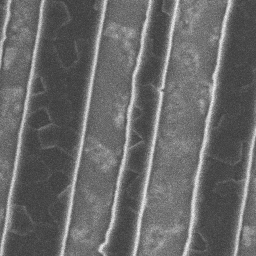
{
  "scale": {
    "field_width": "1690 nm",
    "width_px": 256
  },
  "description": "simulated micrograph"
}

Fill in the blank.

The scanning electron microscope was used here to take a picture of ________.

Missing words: one or a few lines or trenches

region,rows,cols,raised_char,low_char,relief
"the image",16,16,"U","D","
UDDUUUUDDUUDDDUU
DDUUUUDDDUUDDDUU
DDUUUUDDDUUDDDUU
DDUUUUDDDUUDDDUU
DDUUUUDDUUDDDUUU
DDUUUUDDUUDDDUUU
DDUUUUDDUUDDDUUU
DUUUUDDDUUDDDUUU
DUUUUDDDUUDDDUUU
DUUUUDDDUUDDDUUU
DUUUUDDDUDDDUUUU
DUUUUDDUUDDDUUUD
DUUUDDDUUDDDUUUD
UUUUDDDUUDDDUUUD
UUUUDDDUUDDDUUUD
UUUUDDUUUDDDUUUD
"